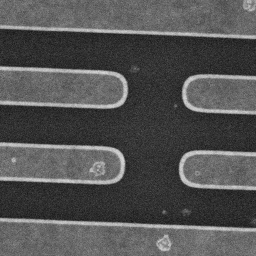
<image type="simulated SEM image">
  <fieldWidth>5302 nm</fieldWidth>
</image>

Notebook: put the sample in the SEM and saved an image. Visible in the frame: groups of lines, slits or small figures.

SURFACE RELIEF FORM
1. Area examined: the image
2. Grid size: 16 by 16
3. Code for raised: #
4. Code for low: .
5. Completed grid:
################
################
................
................
######..........
########....####
..#####.....####
................
................
#######.........
########...#####
............####
................
................
################
################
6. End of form